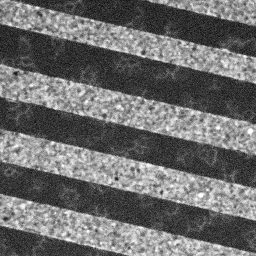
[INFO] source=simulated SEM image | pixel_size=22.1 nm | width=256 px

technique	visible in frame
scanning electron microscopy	parallel lines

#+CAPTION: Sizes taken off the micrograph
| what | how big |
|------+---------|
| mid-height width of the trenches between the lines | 724 nm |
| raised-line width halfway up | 662 nanometres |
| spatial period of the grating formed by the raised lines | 1.44 µm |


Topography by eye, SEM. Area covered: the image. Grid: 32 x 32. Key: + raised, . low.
+++.................++++++++++++
+++++++.................++++++++
+++++++++++..................+++
...+++++++++++++................
.......+++++++++++++............
.......+...+++++++++++++........
................+++++++++++++...
....................++++++++++++
+.......................++++++++
++++++................+.....++++
++++++++++......................
++++++++++++++..................
.++++++++++++++++++.............
......+++++++++++++++++.........
...........++++++++++++++++.....
...............++++++++++++++++.
+..................+++++++++++++
++++++..................++++++++
++++++++++..................++++
++++++++++++++..................
..+++++++++++++++++.............
......+++++++++++++++++.........
..........+++++++++++++++++.....
...............+++++++++++++++++
+..................+++++++++++++
+++++..................+++++++++
+++++++++..................+++++
++++++++++++++..................
..++++++++++++++++..............
......++++++++++++++++..........
..........+++++++++++++++++.....
..............+++++++++++++++++.